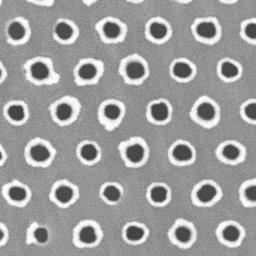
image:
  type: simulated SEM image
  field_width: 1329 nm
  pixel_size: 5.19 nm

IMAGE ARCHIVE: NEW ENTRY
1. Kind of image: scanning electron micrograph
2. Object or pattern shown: a regular array of holes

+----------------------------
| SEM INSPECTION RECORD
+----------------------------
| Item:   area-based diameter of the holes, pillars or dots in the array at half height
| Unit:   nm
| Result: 89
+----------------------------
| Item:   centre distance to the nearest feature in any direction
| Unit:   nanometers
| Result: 240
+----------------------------